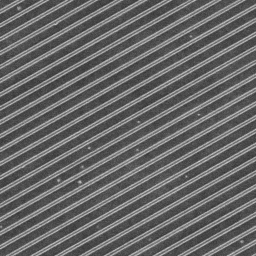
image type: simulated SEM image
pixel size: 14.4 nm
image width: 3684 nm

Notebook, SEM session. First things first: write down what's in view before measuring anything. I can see parallel lines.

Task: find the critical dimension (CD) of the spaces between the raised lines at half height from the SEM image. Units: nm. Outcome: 132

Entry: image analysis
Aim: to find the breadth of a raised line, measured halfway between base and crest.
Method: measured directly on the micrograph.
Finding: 2.84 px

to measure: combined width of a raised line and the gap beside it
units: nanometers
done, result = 174